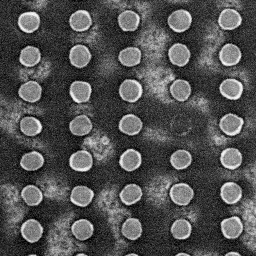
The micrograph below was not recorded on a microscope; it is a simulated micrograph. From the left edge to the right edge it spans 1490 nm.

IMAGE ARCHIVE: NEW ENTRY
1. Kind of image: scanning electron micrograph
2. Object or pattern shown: a regular array of raised bodies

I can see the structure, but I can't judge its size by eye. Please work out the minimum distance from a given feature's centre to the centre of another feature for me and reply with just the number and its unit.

34.3 px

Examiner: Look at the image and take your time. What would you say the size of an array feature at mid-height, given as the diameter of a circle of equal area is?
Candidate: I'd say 120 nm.